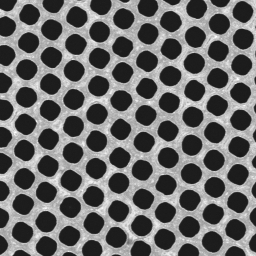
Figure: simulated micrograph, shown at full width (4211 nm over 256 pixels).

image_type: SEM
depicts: a regular array of holes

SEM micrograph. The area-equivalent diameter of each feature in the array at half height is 343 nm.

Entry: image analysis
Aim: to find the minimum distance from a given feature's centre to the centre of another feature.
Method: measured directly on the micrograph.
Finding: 435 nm